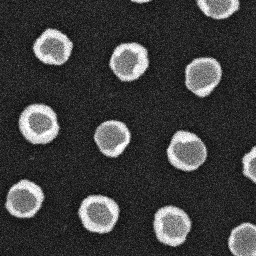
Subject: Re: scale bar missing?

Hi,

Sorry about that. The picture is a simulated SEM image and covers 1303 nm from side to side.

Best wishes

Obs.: a regular array of raised bodies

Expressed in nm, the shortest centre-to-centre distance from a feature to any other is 380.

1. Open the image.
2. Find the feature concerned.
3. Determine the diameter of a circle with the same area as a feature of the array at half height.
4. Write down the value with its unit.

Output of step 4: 178 nanometres